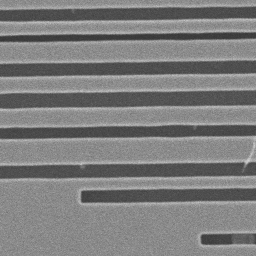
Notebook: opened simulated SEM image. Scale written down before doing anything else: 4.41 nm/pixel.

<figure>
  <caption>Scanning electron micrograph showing groups of lines, slits or small figures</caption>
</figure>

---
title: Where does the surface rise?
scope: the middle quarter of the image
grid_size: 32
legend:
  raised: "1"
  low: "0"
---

00000000000000000000000000000000
00000000000000000000000000000000
00000000000000000000000000000000
11111111111111111111111111111111
11111111111111111111111111111111
11111111111111111111111111111111
11111111111111111111111111111111
00000000000000000000000000000000
00000000000000000000000000000000
00000000000000000000000000000000
00000000000000000000000000000000
11111111111111111111111111111111
11111111111111111111111111111111
11111111111111111111111111111111
11111111111111111111111111111111
11111111000000000000000000000000
00000000000000000000000000000000
00000000000000000000000000000000
00000000000000000011111111111111
11111111111111111111111111111111
11111111111111111111111111111111
11111111111111111111111111111111
11111111111111111111111111111111
11111111111111111111111111111111
11111111111111111111111111111111
00000000000000000000000000000000
00000000000000000000000000000000
00000000000000000000000000000000
00000000000000000001111111111111
11111111111111111111111111111111
11111111111111111111111111111111
11111110000000000000000000000000